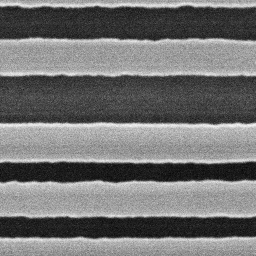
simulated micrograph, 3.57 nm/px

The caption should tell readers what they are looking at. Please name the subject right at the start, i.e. lines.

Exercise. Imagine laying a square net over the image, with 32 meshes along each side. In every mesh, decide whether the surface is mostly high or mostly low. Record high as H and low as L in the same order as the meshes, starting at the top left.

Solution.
HHHHHHHHHHHHHHHHHHHHHHHHHHHHHHHH
LLLLLLLLLLLLLLLLLLLLLLLLLLLLLLLL
LLLLLLLLLLLLLLLLLLLLLLLLLLLLLLLL
LLLLLLLLLLLLLLLLLLLLLLLLLLLLLLLL
LLLLLLLLLLLLLLLLLLLLLLLLLLLLLLLL
HHHHHHHHHHHHHHHHHHHHHHHHHHHHHHHH
HHHHHHHHHHHHHHHHHHHHHHHHHHHHHHHH
HHHHHHHHHHHHHHHHHHHHHHHHHHHHHHHH
HHHHHHHHHHHHHHHHHHHHHHHHHHHHHHHH
LLLLLLLLLLLLLLLLLLLLLLLLLLLLLLLL
LLLLLLLLLLLLLLLLLLLLLLLLLLLLLLLL
LLLLLLLLLLLLLLLLLLLLLLLLLLLLLLLL
LLLLLLLLLLLLLLLLLLLLLLLLLLLLLLLL
LLLLLLLLLLLLLLLLLLLLLLLLLLLLLLLL
LLLLLLLLLLLLLLLLLLLLLLLLLLLLLLLL
LLLHHHLHHLLLHHLLLLLLLLLLLLLLLHLL
HHHHHHHHHHHHHHHHHHHHHHHHHHHHHHHH
HHHHHHHHHHHHHHHHHHHHHHHHHHHHHHHH
HHHHHHHHHHHHHHHHHHHHHHHHHHHHHHHH
HHHHHHHHHHHHHHHHHHHHHHHHHHHHHHHH
LLLLLLLLLLLLLLLLLLLLLLLLLLLLLLLL
LLLLLLLLLLLLLLLLLLLLLLLLLLLLLLLL
LLLLLLLLLLLLLLLLLLLLLLLLLLLLLLLL
HHHHHHHHHHHHHHHHHHHHHHHHHHHHHHHH
HHHHHHHHHHHHHHHHHHHHHHHHHHHHHHHH
HHHHHHHHHHHHHHHHHHHHHHHHHHHHHHHH
HHHHHHHHHHHHHHHHHHHHHHHHHHHHHHHH
LLLLLLLLLLLLLLLLLLLLLLLLLLLLLLLL
LLLLLLLLLLLLLLLLLLLLLLLLLLLLLLLL
LLLLLLLLLLLLLLLLLLLLLLLLLLLLLLLL
HHHHHHHHHHHHHHHHHHHHHHHHHHHHHHHH
HHHHHHHHHHHHHHHHHHHHHHHHHHHHHHHH